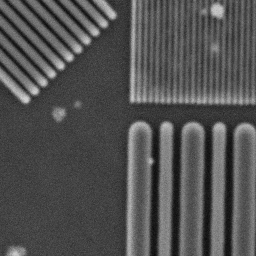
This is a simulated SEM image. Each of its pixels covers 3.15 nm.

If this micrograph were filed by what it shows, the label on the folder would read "groups of lines, slits or small figures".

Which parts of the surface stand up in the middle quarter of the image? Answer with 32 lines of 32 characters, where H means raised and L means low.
LLLLLLLLLLLLLLLLLHLLHHLHHHHHHHHH
LLLLLLLLLLLLLLLLLHLLHHLHHHHHHHHL
LLLLLLLLLLLLLLLLLHHLHHLHHHHHHHHL
LLLLLLLLLLLLLLLLLHHLHHLHHHHHLHHL
LLLLLLLLLLLLLLLLLHHLHHLHHHHHLHHL
LLLLLLLLLLLLLLLLLHHLHHLHHHHHLHHL
LLLLLLLLLLLLLLLLLHHLHHHHHHHHLHHL
LLLLLLLLLLLLLLLLLHHLHHLHHHHHLHHL
LLLLLLLLLLLLLLLLLHHLLHLHHHHHLHHL
LLLLLLLLLLLLLLLLLLLLLLLLHLLHLLLL
LLLLLLLLLLLLLLLLLLLLLLLLLLLLLLLL
LLLLLLLLLLLLLLLLLLLLLLLLLLLLLLLL
LLLLLLLLLLLLLLLLLLLLLLLLLLLLLLLL
LLLLLLLLLLLLLLLLLLLLLLLLLLLLLLLL
LLLLLLLLLLLLLLLLLLLLLLLLLLLLLLLL
LLLLLLLLLLLLLLLLLHHHHLLLHHHLLLHH
LLLLLLLLLLLLLLLLLHHHHHLLHHHLLLHH
LLLLLLLLLLLLLLLLHHHHHHLLHHHLLLHH
LLLLLLLLLLLLLLLLHHHHHHLLHHHLLLHH
LLLLLLLLLLLLLLLLHHHHHHLLHHHLLLHH
LLLLLLLLLLLLLLLLHHHHHHLLHHHLLHHH
LLLLLLLLLLLLLLLLHHHHHHLLHHHLLHHH
LLLLLLLLLLLLLLLLHHHHHHLLHHHLLHHH
LLLLLLLLLLLLLLLLHHHHHHLLHHHLLHHH
LLLLLLLLLLLLLLLLHHHHHHLLHHHLLHHH
LLLLLLLLLLLLLLLLHHHHHHLLHHHLLHHH
LLLLLLLLLLLLLLLLHHHHHHLLHHHLLHHH
LLLLLLLLLLLLLLLLHHHHHHLLHHHLLHHH
LLLLLLLLLLLLLLLLHHHHHHLLHHHLLHHH
LLLLLLLLLLLLLLLLHHHHHHLLHHHLLHHH
LLLLLLLLLLLLLLLLHHHHHHLLHHHLLHHH
LLLLLLLLLLLLLLLLHHHHHHLLHHHLLHHH